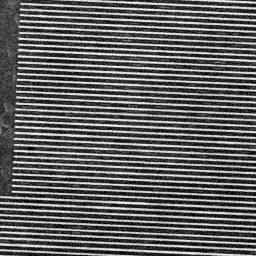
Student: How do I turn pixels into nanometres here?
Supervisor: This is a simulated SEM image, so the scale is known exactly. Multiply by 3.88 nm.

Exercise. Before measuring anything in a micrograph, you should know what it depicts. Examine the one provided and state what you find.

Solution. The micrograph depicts parallel lines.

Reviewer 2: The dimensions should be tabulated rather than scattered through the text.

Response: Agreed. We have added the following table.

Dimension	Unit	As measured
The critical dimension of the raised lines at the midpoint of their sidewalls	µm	0.0053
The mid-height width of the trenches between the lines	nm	17.4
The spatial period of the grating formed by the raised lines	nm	22.8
